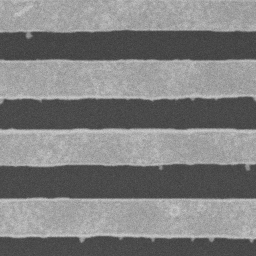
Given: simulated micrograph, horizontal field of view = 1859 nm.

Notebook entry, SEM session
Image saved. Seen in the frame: lines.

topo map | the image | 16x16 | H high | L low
HHHHHHHHHHHHHHHH
HHHHHHHHHHHHHHHH
LLLLLLLLLLLLLLLL
LLLLLLLLLLLLLLLL
HHHHHHHHHHHHHHHH
HHHHHHHHHHHHHHHH
LLLLLLLLLLLLLLLL
LLLLLLLLLLLLLLLL
HHHHHHHHHHHHHHHH
HHHHHHHHHHHHHHHH
LLLLLLLLLLLLLLLL
LLLLLLLLLLLLLLLL
HHHHHHHHHHHHHLHH
HHHHHHHHHHHHHHHH
HHHHHHHHHHHHHHHH
LLLLLLLLLLLLLLLL